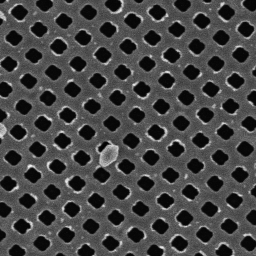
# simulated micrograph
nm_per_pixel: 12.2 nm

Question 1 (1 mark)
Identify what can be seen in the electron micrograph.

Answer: a regular array of holes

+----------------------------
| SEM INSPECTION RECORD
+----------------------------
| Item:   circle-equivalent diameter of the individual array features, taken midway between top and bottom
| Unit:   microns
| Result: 0.186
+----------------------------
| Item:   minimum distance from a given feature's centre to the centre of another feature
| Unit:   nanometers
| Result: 315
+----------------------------